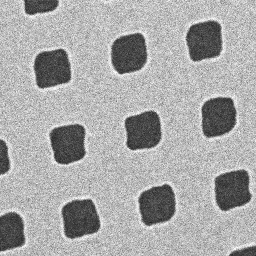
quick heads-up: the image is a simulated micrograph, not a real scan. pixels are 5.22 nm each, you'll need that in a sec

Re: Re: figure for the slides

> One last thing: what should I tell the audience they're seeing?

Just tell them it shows a regular array of holes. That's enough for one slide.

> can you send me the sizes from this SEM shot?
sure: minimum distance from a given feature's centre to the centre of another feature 397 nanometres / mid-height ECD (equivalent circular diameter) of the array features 0.205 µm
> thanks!